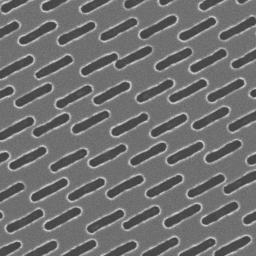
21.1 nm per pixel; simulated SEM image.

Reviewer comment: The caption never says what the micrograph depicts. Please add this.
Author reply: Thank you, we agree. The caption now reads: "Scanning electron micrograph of a regular array of holes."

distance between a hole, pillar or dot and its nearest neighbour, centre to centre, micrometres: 0.723